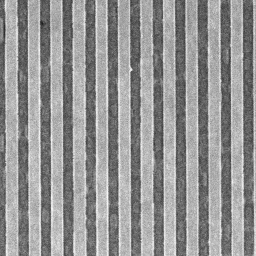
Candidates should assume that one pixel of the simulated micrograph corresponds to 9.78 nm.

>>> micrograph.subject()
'parallel lines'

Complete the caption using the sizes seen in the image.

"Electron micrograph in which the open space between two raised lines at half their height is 11.6 pixels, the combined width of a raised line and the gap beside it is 22.5 pixels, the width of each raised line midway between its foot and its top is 0.112 microns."